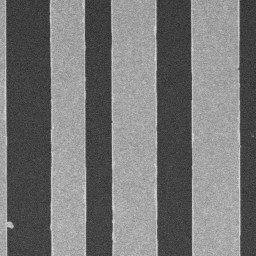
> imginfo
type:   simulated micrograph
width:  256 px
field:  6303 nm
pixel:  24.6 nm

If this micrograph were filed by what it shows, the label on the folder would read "one or a few lines or trenches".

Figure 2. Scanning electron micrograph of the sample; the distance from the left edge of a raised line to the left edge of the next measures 73.7 pixels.